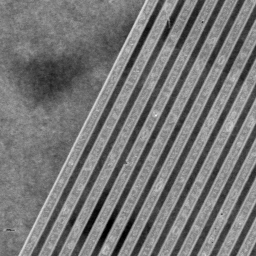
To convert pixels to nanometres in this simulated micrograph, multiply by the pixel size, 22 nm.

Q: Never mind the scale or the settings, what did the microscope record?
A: parallel lines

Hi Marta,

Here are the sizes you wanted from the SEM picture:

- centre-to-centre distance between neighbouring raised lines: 390 nm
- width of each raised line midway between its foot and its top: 226 nm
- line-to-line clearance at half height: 170 nanometers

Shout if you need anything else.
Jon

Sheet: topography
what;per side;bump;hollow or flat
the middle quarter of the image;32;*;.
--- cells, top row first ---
.............**...**...**..***..
............***..***..***..***..
............**...**...**..***..*
...........***..***..***..***..*
...........**...**...**..***..**
..........***..***..***..***..**
..........**...**...**..***..***
.........***..***..***..***..**.
.........**...**..***..***..***.
........***..***..***..***..**..
........**...**...**..***..***..
.......***..***..***..***..**...
.......**...**...**..***..***..*
......***..***..***..***..**...*
......**...**...**..***..***..**
.....***..***..***..***..**...**
.....**...**...**..***..***..***
....***..***..***..***..**...**.
....**...**...**..***..***..***.
...***..***..***..***..**...**..
...**...**...**..***..***..***..
..***..***..***..***..**...**...
..**...**...**..***..***..***..*
.***..***..***..***..**...***..*
.**...**...**...**..***..***..**
***..***..***..***..**...***..**
**...**..***..***..***..***..***
**..***..***..***..**...***..***
*...**..***..***..***..***..***.
*..***..***..***..**...***..***.
...**...**..***..***..***..***..
..***..***..***..**...***..***..